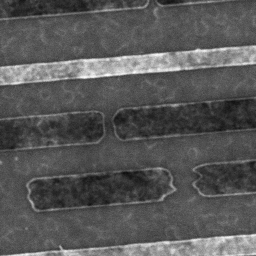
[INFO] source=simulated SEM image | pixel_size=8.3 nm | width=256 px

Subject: one or a few lines or trenches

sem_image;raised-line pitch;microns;0.503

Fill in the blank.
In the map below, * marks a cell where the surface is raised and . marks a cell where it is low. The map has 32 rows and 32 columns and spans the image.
******************..***.........
***********.....................
................................
................................
................................
................................
......................**********
..........**********************
*************************.......
*************...................
*...............................
................................
............................****
................****************
....*********.******************
*************.******************
*************.**************....
************...*................
*****...........................
................................
..........................******
..............*******....*******
....*****************....*******
....******************...*******
....*****************...........
....***********.................
................................
................................
................................
...............................*
...................*************
......**************************